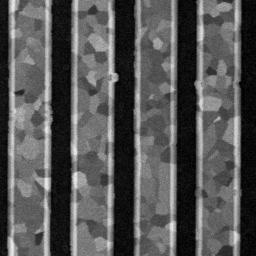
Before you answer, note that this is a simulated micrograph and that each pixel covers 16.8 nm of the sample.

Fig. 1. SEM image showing one or a few lines or trenches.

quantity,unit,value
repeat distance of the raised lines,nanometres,1050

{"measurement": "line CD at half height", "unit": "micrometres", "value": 0.568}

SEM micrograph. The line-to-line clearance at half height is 486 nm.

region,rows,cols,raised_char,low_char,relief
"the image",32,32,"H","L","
LLHHHHLLLLHHHHLLLHHHHHLLLHHHHHLL
LLHHHHLLLLHHHHLLLHHHHHLLLHHHHHLL
LLHHHHLLLLHHHHLLLHHHHHLLLHHHHLLL
LLHHHHLLLLHHHHLLLLHHHHLLLHHHHLLL
LLHHHHLLLLHHHHLLLHHHHHLLLHHHHLLL
LLHHHHLLLLHHHHLLLHHHHHLLLHHHHLLL
LLHHHHLLLLHHHHLLLHHHHHLLLHHHHLLL
LLHHHHLLLLHHHHLLLHHHHHLLLHHHHLLL
LLHHHHLLLLHHHHLLLHHHHLLLLHHHHLLL
LLHHHHLLLLHHHHLLLHHHHLLLLHHHHLLL
LLHHHHLLLLHHHHLLLHHHHLLLLHHHHLLL
LLHHHHLLLLHHHHLLLHHHHLLLLHHHHLLL
LLHHHHLLLLHHHHLLLHHHHLLLLHHHHLLL
LLHHHHLLLLHHHHLLLHHHHLLLLHHHHLLL
LLHHHHLLLLHHHHLLLHHHHLLLLHHHHLLL
LLHHHHLLLLHHHHLLLHHHHLLLLHHHHLLL
LLHHHHLLLLHHHHLLLHHHHLLLLHHHHLLL
LLHHHHLLLHHHHHLLLHHHHLLLLHHHHLLL
LLHHHHLLLHHHHHLLLHHHHLLLLHHHHLLL
LLHHHHLLLHHHHHLLLHHHHLLLLHHHHLLL
LLHHHHLLLHHHHHLLLHHHHLLLLHHHHLLL
LLHHHHLLLHHHHHLLLHHHHLLLLHHHHLLL
LLHHHHLLLHHHHHLLLHHHHLLLLHHHHLLL
LLHHHHLLLHHHHHLLLHHHHLLLLHHHHHLL
LLHHHHLLLHHHHHLLLHHHHLLLLHHHHHLL
LLHHHHLLLHHHHHLLLHHHHLLLLHHHHLLL
LLHHHHLLLHHHHHLLLHHHHLLLLHHHHLLL
LLHHHHLLLHHHHHLLLHHHHLLLLHHHHLLL
LLHHHHLLLHHHHHLLLHHHHLLLLHHHHLLL
LLHHHHLLLHHHHHLLLHHHHLLLLHHHHLLL
LLHHHHLLLHHHHHLLLHHHHLLLLHHHHLLL
LLHHHHLLLHHHHHLLLHHHHLLLLHHHHLLL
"